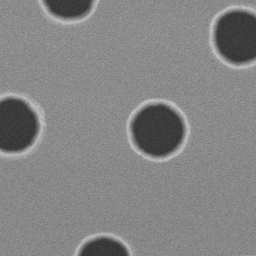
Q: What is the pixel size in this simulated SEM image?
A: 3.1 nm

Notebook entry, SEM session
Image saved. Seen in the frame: holes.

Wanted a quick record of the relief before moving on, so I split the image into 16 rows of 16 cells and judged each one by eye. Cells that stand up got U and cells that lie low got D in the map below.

UUUDDDUUUUUUUUUU
UUUUUUUUUUUUUDDD
UUUUUUUUUUUUUDDD
UUUUUUUUUUUUUUDD
UUUUUUUUUUUUUUUU
UUUUUUUUUUUUUUUU
DDUUUUUUUDDUUUUU
DDUUUUUUDDDDUUUU
DDUUUUUUDDDDUUUU
DUUUUUUUUDDUUUUU
UUUUUUUUUUUUUUUU
UUUUUUUUUUUUUUUU
UUUUUUUUUUUUUUUU
UUUUUUUUUUUUUUUU
UUUUUUUUUUUUUUUU
UUUUUDDDUUUUUUUU